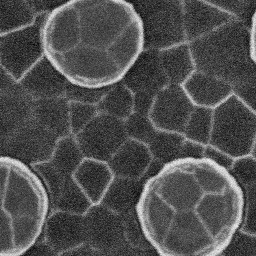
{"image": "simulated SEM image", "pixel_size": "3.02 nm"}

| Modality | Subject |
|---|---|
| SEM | raised bodies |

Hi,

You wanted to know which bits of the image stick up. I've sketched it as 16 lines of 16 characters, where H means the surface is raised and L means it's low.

LLLLHHHHLLLLLLLL
LLLHHHHHHLLLLLLL
LLLHHHHHHLLLLLLL
LLLHHHHHHLLLLLLL
LLLLHHHHLLLLLLLL
LLLLLLLLLLLLLLLL
LLLLLLLLLLLLLLLL
LLLLLLLLLLLLLLLL
LLLLLLLLLLLLLLLL
LLLLLLLLLLLLLLLL
HHLLLLLLLLHHHHLL
HHLLLLLLLHHHHHHL
HHHLLLLLLHHHHHHL
HHHLLLLLLHHHHHHL
HHLLLLLLLHHHHHHL
HHLLLLLLLLHHHHLL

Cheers